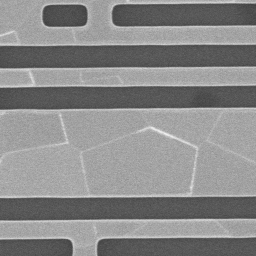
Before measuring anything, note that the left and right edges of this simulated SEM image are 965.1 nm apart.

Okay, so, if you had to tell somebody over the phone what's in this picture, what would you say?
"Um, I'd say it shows groups of lines, slits or small figures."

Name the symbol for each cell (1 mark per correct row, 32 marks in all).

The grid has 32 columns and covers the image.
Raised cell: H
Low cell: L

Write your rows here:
HHHHHHHLLLHHHHHLLLLLLLLLLLLLLLLL
HHHHHLLLLLLHHHLLLLLLLLLLLLLLLLLL
HHHHHLLLLLLHHHLLLLLLLLLLLLLLLLLL
HHHHHHHHHHHHHHHHHHHHHHHHHHHHHHHH
HHHHHHHHHHHHHHHHHHHHHHHHHHHHHHHH
HHHHHHHHHHHHHHHHHHLLHLLLLLLLLLLL
LLLLLLLLLLLLLLLLLLLLLLLLLLLLLLLL
LLLLLLLLLLLLLLLLLLLLLLLLLLLLLLLL
LLLLLLLLLLLLHHHHHHHHHHHHHHHHHHHH
HHHHHHHHHHHHHHHHHHHHHHHHHHHHHHHH
HHHHHHHHHHHHHHHHHHHHHHHHHHHHHHHH
LLLLLLLLLLLLLLLLLLLLLLLLLLLLLLLL
LLLLLLLLLLLLLLLLLLLLLLLLLLLLLLLL
LLLLLLLLLLLLLLLLLLLLLLLLLLLLLLLL
HHHHHHHHHHHHHHHHHHHHHHHHHHHHHHHH
HHHHHHHHHHHHHHHHHHHHHHHHHHHHHHHH
HHHHHHHHHHHHHHHHHHHHHHHHHHHHHHHH
HHHHHHHHHHHHHHHHHHHHHHHHHHHHHHHH
HHHHHHHHHHHHHHHHHHHHHHHHHHHHHHHH
HHHHHHHHHHHHHHHHHHHHHHHHHHHHHHHH
HHHHHHHHHHHHHHHHHHHHHHHHHHHHHHHH
HHHHHHHHHHHHHHHHHHHHHHHHHHHHHHHH
HHHHHHHHHHHHHHHHHHHHHHHHHHHHHHHH
HHHHHHHHHHHHHHHHHHHHHHHHHHHHHHHH
HHHHHHHHHHHHHHHHHHHHHHHHHLLLLLLL
LLLLLLLLLLLLLLLLLLLLLLLLLLLLLLLL
LLLLLLLLLLLLLLLLLLLLLLLLLLLLLLLL
LLLLLLLLLLLLLLLLLLLLLLHHHHHHHHHH
HHHHHHHHHHHHHHHHHHHHHHHHHHHHHHHH
HHHHHHHHHHHHHHHHHHHHHHHHHHHHHHHH
LLLLLLLLLHHHLLLLLLLLLLLLLLLLLLLL
LLLLLLLLLHHHLLLLLLLLLLLLLLLLLLLL